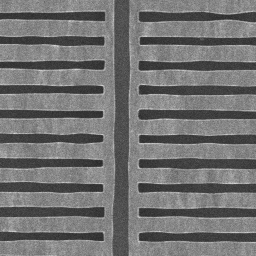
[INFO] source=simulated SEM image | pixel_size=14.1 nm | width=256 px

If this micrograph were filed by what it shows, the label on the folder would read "groups of lines, slits or small figures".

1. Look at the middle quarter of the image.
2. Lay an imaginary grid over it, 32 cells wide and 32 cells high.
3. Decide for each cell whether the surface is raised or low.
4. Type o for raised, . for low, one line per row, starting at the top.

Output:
..........oo.....oo.............
oooooooooooo.....oo.....oooooo..
oooooooooooo.....ooooooooooooooo
oooooooooooo.....ooooooooooooooo
oooooooooooo.....ooooooooooooooo
.........ooo.....oo.............
..........ooo...ooo.............
o........oooo...ooo.............
ooooooooooooo...oooooooooooooooo
ooooooooooooo...oooooooooooooooo
ooooooooooooo...oooooooooooooooo
ooooooooooooo...ooo.............
..........ooo...ooo.............
ooo......oooo...ooo.............
ooooooooooooo...oooooooooooooooo
oooooooooooo....oooooooooooooooo
oooooooooooo....oooooooooooooooo
........oooo....ooooooooooooo..o
..........oo....ooo.............
.........ooo....ooo.............
oooooooooooo....oooooooooooooooo
oooooooooooo....oooooooooooooooo
oooooooooooo....oooooooooooooooo
ooooooooooooo...oooooooooooooo..
..........ooo...ooo.............
..........ooo...ooo.............
ooooooooooooo...oooooooooooooooo
ooooooooooooo...oooooooooooooooo
ooooooooooooo...oooooooooooooooo
oooooooooooo....oooooooooooooooo
..........oo....oo..............
..........oo....ooo.............